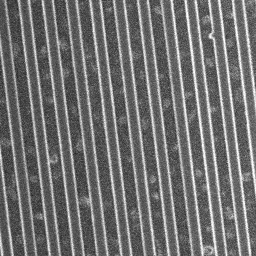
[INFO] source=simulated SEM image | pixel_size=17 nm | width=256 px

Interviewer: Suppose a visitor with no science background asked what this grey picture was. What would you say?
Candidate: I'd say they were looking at parallel lines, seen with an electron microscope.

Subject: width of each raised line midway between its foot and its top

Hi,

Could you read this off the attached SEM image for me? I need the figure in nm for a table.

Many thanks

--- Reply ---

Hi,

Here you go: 181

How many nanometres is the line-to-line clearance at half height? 225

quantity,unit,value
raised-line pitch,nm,400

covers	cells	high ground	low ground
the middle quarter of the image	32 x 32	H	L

LLLHHLLLLHHLLLHHHLLLLHHLLLHHHLLL
LLLHHLLLLHHLLLLHHLLLLHHLLLHHHLLL
LLLHHLLLLHHLLLLHHLLLLHHLLLLHHLLL
LLLHHLLLLHHHLLLHHLLLLHHLLLLHHLLL
LLLHHHLLLHHHLLLHHLLLLHHHLLLHHLLL
LLLHHHLLLHHHLLLHHHLLLHHHLLLHHLLL
LLLHHHLLLHHHLLLHHHLLLHHHLLLHHHLL
LLLHHHLLLHHHLLLHHHLLLHHHLLLHHHLL
LLLLHHLLLLHHLLLHHHLLLHHHLLLHHHLL
LLLLHHLLLLHHLLLLHHLLLLHHLLLHHHLL
LLLLHHLLLLHHLLLLHHLLLLHHLLLLHHLL
HLLLHHLLLLHHLLLLHHLLLLHHLLLLHHLL
HLLLHHHLLLHHHLLLHHLLLLHHHLLLHHLL
HLLLHHHLLLHHHLLLHHHLLLHHHLLLHHLL
HLLLHHHLLLHHHLLLHHHLLLHHHLLLHHHL
HLLLHHHLLLHHHLLLHHHLLLHHHLLLHHHL
HLLLHHHLLLLHHLLLHHHLLLHHHLLLHHHL
HLLLLHHLLLLHHLLLLHHLLLLHHLLLHHHL
HLLLLHHLLLLHHLLLLHHLLLLHHLLLLHHL
HHLLLHHLLLLHHLLLLHHLLLLHHLLLLHHL
HHLLLHHHLLLHHHLLLHHLLLLHHLLLLHHL
HHLLLHHHLLLHHHLLLHHHLLLHHHLLLHHL
HHLLLHHHLLLHHHLLLHHHLLLHHHLLLHHH
HHLLLHHHLLLHHHLLLHHHLLLHHHLLLHHH
HHLLLHHHLLLLHHLLLHHHLLLHHHLLLHHH
HHLLLLHHLLLLHHLLLHHHLLLLHHLLLHHH
HHLLLLHHLLLLHHLLLLHHLLLLHHLLLLHH
HHHLLLHHLLLLHHLLLLHHLLLLHHLLLLHH
HHHLLLHHLLLLHHHLLLHHLLLLHHLLLLHH
HHHLLLHHHLLLHHHLLLHHHLLLHHHLLLHH
HHHLLLHHHLLLHHHLLLHHHLLLHHHLLLHH
HHHLLLHHHLLLHHHLLLHHHLLLHHHLLLHH